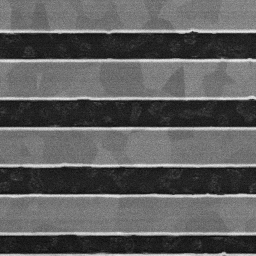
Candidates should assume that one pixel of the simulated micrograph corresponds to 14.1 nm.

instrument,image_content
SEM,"one or a few lines or trenches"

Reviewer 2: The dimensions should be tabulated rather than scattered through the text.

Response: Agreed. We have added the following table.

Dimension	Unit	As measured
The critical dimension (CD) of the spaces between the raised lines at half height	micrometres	0.413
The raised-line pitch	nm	949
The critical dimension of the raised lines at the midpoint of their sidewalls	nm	532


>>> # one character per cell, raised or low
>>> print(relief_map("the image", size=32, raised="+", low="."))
++++++++++++++++++++++++++++++++
++++++++++++++++++++++++++++++++
++++++++++++++++++++++++++++++++
++++++++++++++++++++++++++++++++
................................
................................
................................
................................
++++++++++++++++++++++++++++++++
++++++++++++++++++++++++++++++++
++++++++++++++++++++++++++++++++
++++++++++++++++++++++++++++++++
................................
................................
................................
................................
++++++++++++++++++++++++++++++++
++++++++++++++++++++++++++++++++
++++++++++++++++++++++++++++++++
++++++++++++++++++++++++++++++++
++++++++++++++++++++++++++++++++
................................
................................
................................
+..+++....+++.....++.....+....+.
++++++++++++++++++++++++++++++++
++++++++++++++++++++++++++++++++
++++++++++++++++++++++++++++++++
++++++++++++++++++++++++++++++++
................................
................................
................................